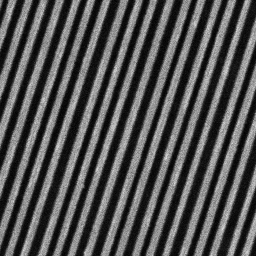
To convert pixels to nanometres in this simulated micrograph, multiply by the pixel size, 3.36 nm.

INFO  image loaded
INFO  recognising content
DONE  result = parallel lines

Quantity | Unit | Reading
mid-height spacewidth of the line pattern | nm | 25.6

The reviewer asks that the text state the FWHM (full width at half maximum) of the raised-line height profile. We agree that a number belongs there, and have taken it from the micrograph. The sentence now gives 7.62 pixels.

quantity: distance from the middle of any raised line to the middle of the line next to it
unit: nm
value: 50.3